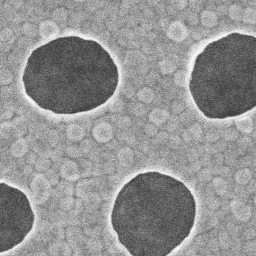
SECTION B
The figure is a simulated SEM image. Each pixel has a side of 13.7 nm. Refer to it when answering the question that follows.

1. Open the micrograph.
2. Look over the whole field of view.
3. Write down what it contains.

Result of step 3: holes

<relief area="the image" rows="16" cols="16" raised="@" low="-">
@@@@@@@@@@@@@@@@
@@@@@@@@@@@@@@@@
@@@---@@@@@@@@--
@@-----@@@@@----
@------@@@@@----
@@-----@@@@@----
@@----@@@@@@----
@@@@@@@@@@@@@@@@
@@@@@@@@@@@@@@@@
@@@@@@@@@@@@@@@@
@@@@@@@@@@@@@@@@
@@@@@@@@---@@@@@
--@@@@@-----@@@@
--@@@@@-----@@@@
--@@@@@-----@@@@
-@@@@@@@---@@@@@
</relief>